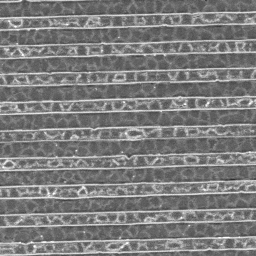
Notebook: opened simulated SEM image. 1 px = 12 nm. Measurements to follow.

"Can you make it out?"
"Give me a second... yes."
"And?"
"parallel lines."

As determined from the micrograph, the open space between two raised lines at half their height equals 192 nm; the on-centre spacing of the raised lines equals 338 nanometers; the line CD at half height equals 147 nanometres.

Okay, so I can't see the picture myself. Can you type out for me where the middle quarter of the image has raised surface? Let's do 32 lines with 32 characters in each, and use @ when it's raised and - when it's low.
--------------------------------
------------------------------@@
@@@@@@@@@@@@@@@@@@@@@@@@@@@@@@@@
@@@@@@@@@@@@@@@@@@@@@@@@@@@@@@@@
@@@@@@@@@@@@@@@@@@@--------@@---
--------------------@-----------
--------------------------------
--------------------------------
----------------------------@@@@
@@@@@@@@@@@@@@@@@@@@@@@@@@@@@@@@
@@@@@@@@@@@@@@@@@@@@@@@@@@@@@@@@
@@@@@@@@@@@@@@@@@@@@@-@@@@@-----
--------------------------------
--------------------------------
--------------------------------
--------------------------------
@@@@@@@@@@@@@@@@@@@@@@@@@@@@@@@@
@@@@@@@@@@@@@@@@@@@@@@@@@@@@@@@@
@@@@@@@@@@@@@@@@@@@@@@@@--------
--------------------------------
--------------------------------
--------------------------------
--------------------------------
@-@@@@@@@@@@@@@@-@@@@@@@@@@@@@@@
@@@@@@@@@@@@@@@@@@@@@@@@@@@@@@@@
@@@@@@@@@@@@@@@@@@@@@@@@@@------
-------------------------------@
-------------------------------@
--------------------------------
--------------------------------
@@@@@@@@@@@@@@@@@@@@@@@@@@@@@@@@
@@@@@@@@@@@@@@@@@@@@@@@@@@@@@@@@